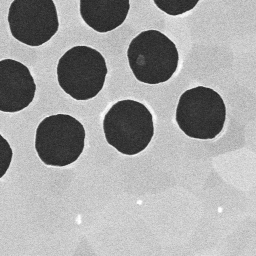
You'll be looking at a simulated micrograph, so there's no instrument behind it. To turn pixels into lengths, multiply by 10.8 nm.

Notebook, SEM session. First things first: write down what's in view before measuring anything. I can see holes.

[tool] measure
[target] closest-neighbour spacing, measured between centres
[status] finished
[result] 764 nm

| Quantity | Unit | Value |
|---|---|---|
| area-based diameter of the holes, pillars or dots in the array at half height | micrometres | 0.56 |